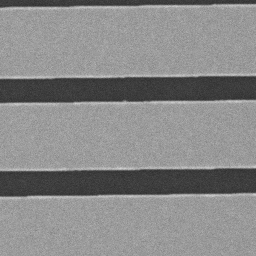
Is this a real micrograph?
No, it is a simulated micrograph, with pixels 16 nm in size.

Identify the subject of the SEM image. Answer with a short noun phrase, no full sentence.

lines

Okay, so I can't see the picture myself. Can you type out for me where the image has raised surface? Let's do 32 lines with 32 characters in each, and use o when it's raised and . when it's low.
................................
oooooooooooooooooooooooooooooooo
oooooooooooooooooooooooooooooooo
oooooooooooooooooooooooooooooooo
oooooooooooooooooooooooooooooooo
oooooooooooooooooooooooooooooooo
oooooooooooooooooooooooooooooooo
oooooooooooooooooooooooooooooooo
oooooooooooooooooooooooooooooooo
ooooooooooooooooooooooooo.......
................................
................................
................................
oooooooooooooooooooooooooooooooo
oooooooooooooooooooooooooooooooo
oooooooooooooooooooooooooooooooo
oooooooooooooooooooooooooooooooo
oooooooooooooooooooooooooooooooo
oooooooooooooooooooooooooooooooo
oooooooooooooooooooooooooooooooo
oooooooooooooooooooooooooooooooo
................................
................................
................................
............oooooooooooooooooooo
oooooooooooooooooooooooooooooooo
oooooooooooooooooooooooooooooooo
oooooooooooooooooooooooooooooooo
oooooooooooooooooooooooooooooooo
oooooooooooooooooooooooooooooooo
oooooooooooooooooooooooooooooooo
oooooooooooooooooooooooooooooooo